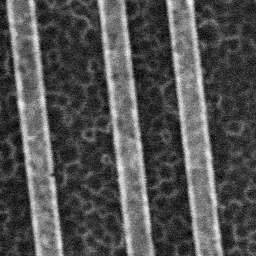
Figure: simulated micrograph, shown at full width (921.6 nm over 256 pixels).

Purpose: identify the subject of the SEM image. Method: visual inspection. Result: one or a few lines or trenches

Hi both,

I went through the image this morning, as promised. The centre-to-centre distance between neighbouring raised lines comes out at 285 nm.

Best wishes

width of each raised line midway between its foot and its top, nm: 80.1